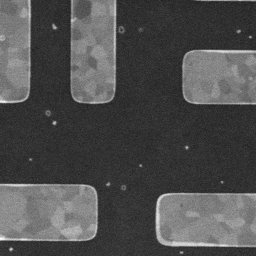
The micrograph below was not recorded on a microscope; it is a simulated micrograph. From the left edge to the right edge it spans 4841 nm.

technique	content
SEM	groups of lines, slits or small figures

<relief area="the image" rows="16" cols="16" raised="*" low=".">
**..***.........
**..***.........
**..***.........
**..***.....****
**..***....*****
**..***....*****
................
................
................
................
................
................
******....******
******....******
******....******
................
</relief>